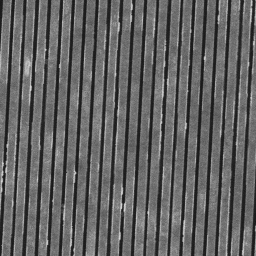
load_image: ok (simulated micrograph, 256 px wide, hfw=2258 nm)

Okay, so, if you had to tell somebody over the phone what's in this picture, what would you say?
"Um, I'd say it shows parallel lines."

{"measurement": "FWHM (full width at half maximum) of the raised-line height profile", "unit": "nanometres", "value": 74.9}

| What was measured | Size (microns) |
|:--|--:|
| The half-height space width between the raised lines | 0.0297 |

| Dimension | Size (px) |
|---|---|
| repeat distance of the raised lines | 12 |